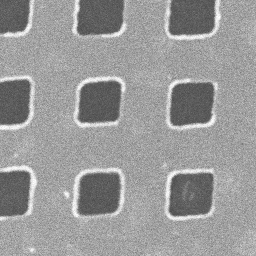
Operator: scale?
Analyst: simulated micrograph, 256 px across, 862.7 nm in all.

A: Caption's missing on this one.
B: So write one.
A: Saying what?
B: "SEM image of holes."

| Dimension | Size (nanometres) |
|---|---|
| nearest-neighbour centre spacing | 308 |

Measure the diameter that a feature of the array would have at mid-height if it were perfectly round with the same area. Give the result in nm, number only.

156